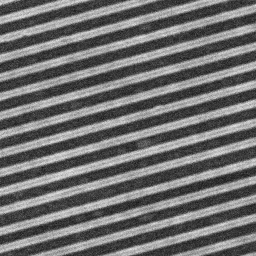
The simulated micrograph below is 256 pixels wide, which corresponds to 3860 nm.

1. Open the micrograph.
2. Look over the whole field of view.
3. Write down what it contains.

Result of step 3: parallel lines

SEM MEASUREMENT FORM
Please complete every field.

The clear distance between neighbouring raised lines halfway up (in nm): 182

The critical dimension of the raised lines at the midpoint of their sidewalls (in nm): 83.7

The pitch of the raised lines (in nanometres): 277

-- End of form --